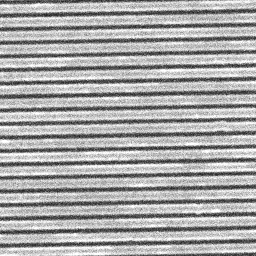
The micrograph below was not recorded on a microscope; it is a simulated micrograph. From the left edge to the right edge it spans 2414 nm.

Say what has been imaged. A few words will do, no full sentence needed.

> parallel lines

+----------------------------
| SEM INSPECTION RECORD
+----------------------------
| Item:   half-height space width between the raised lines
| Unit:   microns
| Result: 0.0519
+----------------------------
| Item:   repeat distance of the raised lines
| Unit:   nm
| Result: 128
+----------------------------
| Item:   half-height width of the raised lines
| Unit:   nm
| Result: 77.8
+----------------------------